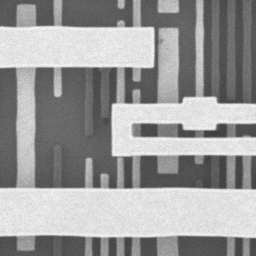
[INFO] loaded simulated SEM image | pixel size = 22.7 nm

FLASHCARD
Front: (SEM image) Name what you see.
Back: wiring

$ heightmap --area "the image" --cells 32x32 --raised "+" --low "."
................................
................................
................................
+++++++++++++++++++.............
+++++++++++++++++++.............
+++++++++++++++++++.............
+++++++++++++++++++.............
+++++++++++++++++++.............
................................
................................
................................
................................
.......................++++.....
..............++++++++++++++++++
..............++++++++++++++++++
..............+++......++++.....
..............++................
..............++++++++++++++++++
..............++++++++++++++++++
................................
................................
................................
................................
................................
++++++++++++++++++++++++++++++++
++++++++++++++++++++++++++++++++
++++++++++++++++++++++++++++++++
++++++++++++++++++++++++++++++++
++++++++++++++++++++++++++++++++
+.........+++++++++++.....++++++
................................
................................